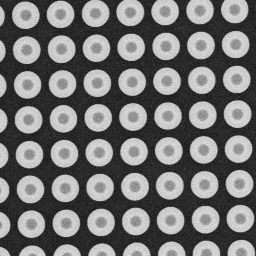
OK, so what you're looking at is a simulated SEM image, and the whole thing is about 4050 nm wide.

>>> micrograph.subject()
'an array of small figures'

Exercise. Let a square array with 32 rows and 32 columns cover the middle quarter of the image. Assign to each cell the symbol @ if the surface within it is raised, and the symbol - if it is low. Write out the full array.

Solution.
--------------------------------
--------@-------@@@-----@@@@----
@@----@@@@@---@@@@@@---@@@@@@--@
@@@--@@@@@@---@@@@@@--@@@@@@@--@
@@@--@@@@@@@--@@@@@@--@@@@@@@--@
@@@--@@@@@@@--@@@@@@---@@@@@@--@
@@@--@@@@@@---@@@@@@---@@@@@----
@@----@@@@-----@@@@------@@-----
--------------------------------
--------------------------------
@------@@@-----@@@@-----@@@@----
@@----@@@@@---@@@@@@---@@@@@@---
@@@--@@@@@@@--@@@@@@@--@@@@@@--@
@@@--@@@@@@@--@@@@@@@--@@@@@@--@
@@@--@@@@@@@--@@@@@@---@@@@@@---
@@@---@@@@@----@@@@@----@@@@----
@@-----@@@------@@--------------
--------------------------------
-------------------------@@-----
@@-----@@@@----@@@@@----@@@@@---
@@@---@@@@@@--@@@@@@@--@@@@@@---
@@@---@@@@@@--@@@@@@@--@@@@@@@--
@@@---@@@@@@--@@@@@@@--@@@@@@@--
@@@---@@@@@@---@@@@@@--@@@@@@---
@@@---@@@@@----@@@@@----@@@@----
@-------------------------------
--------------------------------
-----------------@@------@@@----
@@-----@@@@----@@@@@----@@@@@---
@@@---@@@@@@---@@@@@@--@@@@@@@--
@@@@--@@@@@@--@@@@@@@--@@@@@@@--
@@@@--@@@@@@--@@@@@@@--@@@@@@@--